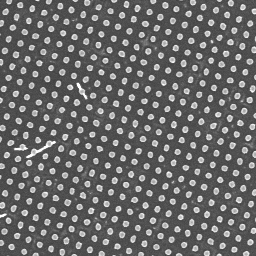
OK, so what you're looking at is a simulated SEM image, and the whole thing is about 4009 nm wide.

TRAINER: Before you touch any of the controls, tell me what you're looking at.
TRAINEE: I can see a regular array of raised bodies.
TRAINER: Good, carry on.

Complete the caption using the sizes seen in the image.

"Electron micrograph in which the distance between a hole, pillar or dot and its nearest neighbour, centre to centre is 184 nanometres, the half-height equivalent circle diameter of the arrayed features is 91.8 nanometres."